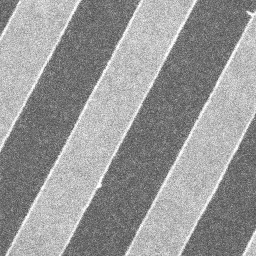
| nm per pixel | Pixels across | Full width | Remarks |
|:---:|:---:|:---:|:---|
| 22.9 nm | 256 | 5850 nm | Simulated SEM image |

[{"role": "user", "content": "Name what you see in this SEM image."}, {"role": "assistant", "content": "one or a few lines or trenches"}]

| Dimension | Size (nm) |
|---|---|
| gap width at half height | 1300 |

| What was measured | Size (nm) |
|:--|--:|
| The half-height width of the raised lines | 1090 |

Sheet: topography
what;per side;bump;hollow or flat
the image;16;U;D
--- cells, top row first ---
DUUUUDDDDUUUDDDD
DUUUDDDDUUUDDDDD
UUUUDDDDUUUDDDDU
UUUDDDDUUUDDDDUU
UUUDDDUUUUDDDDUU
UUDDDDUUUDDDDUUU
UUDDDUUUUDDDDUUU
UDDDDUUUDDDDUUUU
DDDDUUUUDDDDUUUD
DDDDUUUDDDDUUUUD
DDDUUUUDDDDUUUDD
DDDUUUDDDDUUUUDD
DDUUUUDDDDUUUDDD
DDUUUDDDDUUUUDDD
DUUUUDDDDUUUDDDD
DUUUDDDDUUUDDDDU